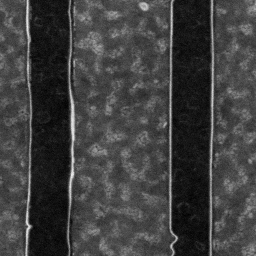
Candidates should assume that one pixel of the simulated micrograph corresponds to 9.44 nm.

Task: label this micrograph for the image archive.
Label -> one or a few lines or trenches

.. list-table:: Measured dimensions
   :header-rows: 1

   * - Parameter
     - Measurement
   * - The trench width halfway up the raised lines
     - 0.941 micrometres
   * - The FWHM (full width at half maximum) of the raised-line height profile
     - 395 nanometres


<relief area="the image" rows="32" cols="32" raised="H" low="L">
LLLHHHHHHLLLLLLLLLLLLHHHHHHLLLLL
LLLHHHHHHLLLLLLLLLLLLHHHHHHLLLLL
LLLHHHHHHLLLLLLLLLLLLHHHHHHLLLLL
LLLHHHHHHLLLLLLLLLLLLHHHHHHLLLLL
LLLLHHHHHLLLLLLLLLLLLHHHHHHLLLLL
LLLLHHHHHLLLLLLLLLLLLHHHHHHLLLLL
LLLLHHHHHLLLLLLLLLLLLHHHHHHLLLLL
LLLLHHHHHLLLLLLLLLLLLHHHHHHLLLLL
LLLHHHHHHLLLLLLLLLLLLHHHHHHLLLLL
LLLHHHHHHLLLLLLLLLLLLHHHHHHLLLLL
LLLHHHHHHLLLLLLLLLLLLHHHHHHLLLLL
LLLLHHHHHLLLLLLLLLLLLHHHHHHLLLLL
LLLLHHHHHLLLLLLLLLLLLHHHHHHLLLLL
LLLLHHHHHLLLLLLLLLLLLHHHHHLLLLLL
LLLLHHHHHLLLLLLLLLLLLHHHHHHLLLLL
LLLLHHHHHLLLLLLLLLLLLHHHHHHLLLLL
LLLLHHHHHLLLLLLLLLLLLHHHHHLLLLLL
LLLLHHHHHLLLLLLLLLLLLHHHHHLLLLLL
LLLLHHHHHLLLLLLLLLLLLHHHHHLLLLLL
LLLLHHHHHLLLLLLLLLLLLHHHHHLLLLLL
LLLLHHHHHLLLLLLLLLLLLHHHHHLLLLLL
LLLLHHHHHLLLLLLLLLLLLHHHHHLLLLLL
LLLLHHHHHLLLLLLLLLLLLHHHHHLLLLLL
LLLLHHHHHLLLLLLLLLLLLHHHHHLLLLLL
LLLLHHHHHLLLLLLLLLLLLHHHHHLLLLLL
LLLLHHHHHLLLLLLLLLLLLHHHHHLLLLLL
LLLHHHHHHLLLLLLLLLLLLHHHHHLLLLLL
LLLHHHHHHLLLLLLLLLLLLHHHHHLLLLLL
LLLLHHHHHLLLLLLLLLLLLHHHHHLLLLLL
LLLHHHHHLLLLLLLLLLLLLLHHHHLLLLLL
LLLHHHHHHLLLLLLLLLLLLLHHHHLLLLLL
LLLHHHHHHLLLLLLLLLLLLLHHHHLLLLLL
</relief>